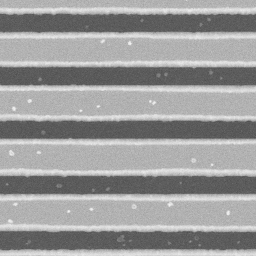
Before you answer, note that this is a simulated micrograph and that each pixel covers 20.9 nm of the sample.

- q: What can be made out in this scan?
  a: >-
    lines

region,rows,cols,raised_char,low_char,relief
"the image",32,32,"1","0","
11111111111111111111111111111111
11111111111111111111111111111111
00000000000000000000000000000000
00000000000000000000000000000000
11111111111111111111111111111111
11111111111111111111111111111111
11111111111111111111111111111111
11111111111111111111111111111111
00000000000000000000000000000000
00000000000000000000000000000000
00000000000000000000000000000000
11111111111111111111111111111111
11111111111111111111111111111111
11111111111111111111111111111111
11111111111111111111111111111111
00000000000000000000000000000000
00000000000000000000000000000000
00000000000000000000000000000000
11111111111111111111111111111111
11111111111111111111111111111111
11111111111111111111111111111111
11111111111111111111111111111111
00000000000000000000000000000000
00000000000000000000000000000000
00000011100010000000000100001011
11111111111111111111111111111111
11111111111111111111111111111111
11111111111111111111111111111111
11111111111111111111111111111111
00000000000000000000000000000000
00000000000000000000000000000000
11111111111111111111111111111111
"